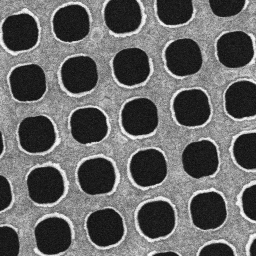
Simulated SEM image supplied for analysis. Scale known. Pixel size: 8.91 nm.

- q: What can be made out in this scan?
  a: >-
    a regular array of holes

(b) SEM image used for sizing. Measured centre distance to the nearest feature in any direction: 459 nm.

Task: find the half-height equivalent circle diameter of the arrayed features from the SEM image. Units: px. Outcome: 37.6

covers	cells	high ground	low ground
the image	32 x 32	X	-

XXXXXXXXXXXXX----XXX----XX-----X
XXXXXXX----XX-----XX----XXX---XX
X---XXX----XX-----XX----XXXXXXXX
-----XX----XXX---XXXXXXXXXXXXXXX
-----XX----XXXXXXXXXXXXXXXXX---X
X---XXXXXXXXXXXXXXXXX----XX-----
XXXXXXXXXXXXXXX---XXX----XX-----
XXXXXXXX----XX-----XX----XX----X
XX---XXX----XX-----XX----XXXXXXX
X-----XX----XX----XXXXXXXXXXXXXX
X-----XX----XXX--XXXXXXXXXXXX---
X-----XXX-XXXXXXXXXXXXX--XXX----
XX--XXXXXXXXXXXXX--XXX----XX----
XXXXXXXXXXX-XXX-----XX----XX----
XXXX-XXXX----XX-----XX----XXX--X
XXX---XXX----XX-----XXX--XXXXXXX
XX-----XX----XXX---XXXXXXXXXXXXX
XX-----XX----XXXXXXXXXXXXXXXXX--
XXX---XXXXXXXXXXXXXXXXX----XX---
XXXXXXXXXXXXXXXXX---XXX----XX---
XXXXXXXXXX----XX-----XX----XXX--
XXXX---XXX----XX-----XX----XXXXX
-XX-----XX----XXX---XXXXXXXXXXXX
-XX-----XX----XXXXXXXXXXXXXXXXX-
-XXX----XXXXXXXXXXXXXXXX----XX--
-XXXXXXXXXXXXXXXXX---XXX----XX--
XXXXXXXXXXXX---XX-----XX----XXX-
XXXXXX--XXX----XX-----XX----XXXX
-XXX-----XX----XXX----XXX--XXXXX
--XX-----XX----XXX--XXXXXXXXXXXX
--XXX----XXX--XXXXXXXXXXXX--XXX-
--XXX---XXXXXXXXXXXXXXXXX----XX-